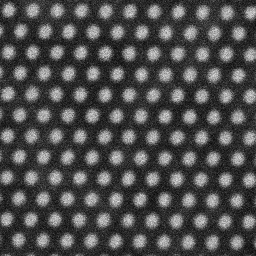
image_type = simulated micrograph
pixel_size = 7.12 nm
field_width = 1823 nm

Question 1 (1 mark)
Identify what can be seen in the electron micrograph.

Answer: a regular array of raised bodies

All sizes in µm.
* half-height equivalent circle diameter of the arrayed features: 0.0865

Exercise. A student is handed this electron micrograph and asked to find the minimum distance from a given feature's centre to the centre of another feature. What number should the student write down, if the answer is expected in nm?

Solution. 170